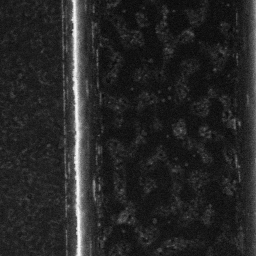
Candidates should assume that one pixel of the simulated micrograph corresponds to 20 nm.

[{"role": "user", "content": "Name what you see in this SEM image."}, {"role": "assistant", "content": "one or a few lines or trenches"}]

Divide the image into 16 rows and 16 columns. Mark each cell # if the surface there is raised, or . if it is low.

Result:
#####...........
#####...........
#####...........
#####...........
#####...........
#####...........
#####...........
#####...........
#####...........
#####...........
#####...........
#####...........
#####...........
#####...........
#####...........
#####...........